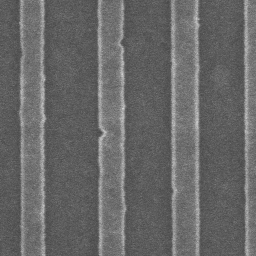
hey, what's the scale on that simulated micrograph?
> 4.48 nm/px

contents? one or a few lines or trenches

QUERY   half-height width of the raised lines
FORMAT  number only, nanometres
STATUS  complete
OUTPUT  104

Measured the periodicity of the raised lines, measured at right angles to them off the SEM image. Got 342 nanometres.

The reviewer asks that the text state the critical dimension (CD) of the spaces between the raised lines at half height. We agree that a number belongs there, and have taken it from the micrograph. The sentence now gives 225 nm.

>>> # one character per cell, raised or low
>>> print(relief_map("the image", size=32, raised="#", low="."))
...##.......###.......###......#
...##.......###.......###......#
...##.......###.......###......#
...##.......###.......###......#
...##.......###.......###......#
...##.......###.......###......#
...##.......###.......###......#
...##.......###.......###......#
...##.......###.......###......#
...##.......###.......###......#
...##.......###.......###......#
...##.......###.......###......#
...##.......###.......###......#
...##.......###.......###......#
...##.......###.......###......#
...##.......###.......###......#
...##........##.......###......#
...##.......###.......###......#
...##.......###.......###......#
...##........##.......###......#
...##........##.......###......#
...##........##.......###......#
...##........##.......###......#
...##........##.......###......#
...##........##.......###......#
...##........###......###......#
...##........##.......###......#
...##........##.......###......#
...##........##.......###......#
...##........##.......###......#
...##........##.......###......#
...##........##.......###......#